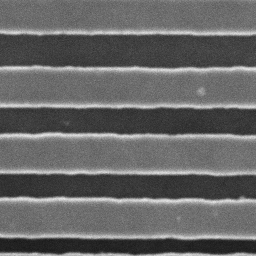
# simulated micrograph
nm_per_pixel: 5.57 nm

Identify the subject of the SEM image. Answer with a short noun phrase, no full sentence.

lines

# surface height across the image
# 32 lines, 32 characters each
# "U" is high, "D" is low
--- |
UUUUUUUUUUUUUUUUUUUUUUUUUUUUUUUU
UUUUUUUUUUUUUUUUUUUUUUUUUUUUUUUU
UUUUUUUUUUUUUUUUUUUUUUUUUUUUUUUU
UUUUUUUUUUUUUUUUUUUUUUUUUUUUUUUU
DDDDDDDDDDDDDDDDDDDDDDDDDDDDDDDD
DDDDDDDDDDDDDDDDDDDDDDDDDDDDDDDD
DDDDDDDDDDDDDDDDDDDDDDDDDDDDDDDD
DDDDDDDDDDDDDDDDDDDDDDDDDDDDDDDD
UUUUUUUDUUDDDDDDUDDDDDDDDDDDDUUD
UUUUUUUUUUUUUUUUUUUUUUUUUUUUUUUU
UUUUUUUUUUUUUUUUUUUUUUUUUUUUUUUU
UUUUUUUUUUUUUUUUUUUUUUUUUUUUUUUU
UUUUUUUUUUUUUUUUUUUUUUUUUUUUUUUU
DDDDDDDDDDDDDDDDDDDDDDDDDDDDDDDD
DDDDDDDDDDDDDDDDDDDDDDDDDDDDDDDD
DDDDDDDDDDDDDDDDDDDDDDDDDDDDDDDD
DDDDDDDDDDDDDDDDDDDDDDDDDDDDDDDD
UUUUUUUUUUUUUUUUUUUUUUUUUUUUUUUU
UUUUUUUUUUUUUUUUUUUUUUUUUUUUUUUU
UUUUUUUUUUUUUUUUUUUUUUUUUUUUUUUU
UUUUUUUUUUUUUUUUUUUUUUUUUUUUUUUU
UUUUUUUUUUUUUUUUUUUUUUUUUUUUUUUU
DDDDDDDDDDDDDDDDDDDDDDDDDDDDDDDD
DDDDDDDDDDDDDDDDDDDDDDDDDDDDDDDD
DDDDDDDDDDDDDDDDDDDDDDDDDDDDDDDD
UUUUUUUUUUUUUUUUUUUUUUUUUUUUUUUU
UUUUUUUUUUUUUUUUUUUUUUUUUUUUUUUU
UUUUUUUUUUUUUUUUUUUUUUUUUUUUUUUU
UUUUUUUUUUUUUUUUUUUUUUUUUUUUUUUU
UUUUUUUUUUUUUUUUUUUUUUUUUUUUUUUU
DDDDDDDDDDDDDDDDDDDDDDDDDDDDDDDD
DDDDDDDDDDDDDDDDDDDDDDDDDDDDDDDD